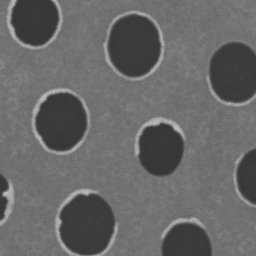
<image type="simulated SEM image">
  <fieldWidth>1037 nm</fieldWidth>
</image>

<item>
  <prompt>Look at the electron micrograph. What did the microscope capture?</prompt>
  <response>holes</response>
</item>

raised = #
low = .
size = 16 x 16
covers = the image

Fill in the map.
#...############
#...###...######
#..####...######
#######...###...
########.####...
#############...
###..###########
##...###########
##...####..#####
#########..#####
#########..####.
###############.
####..##########
####...#########
####...####..###
####...###...###